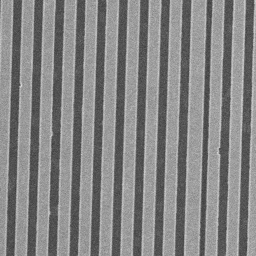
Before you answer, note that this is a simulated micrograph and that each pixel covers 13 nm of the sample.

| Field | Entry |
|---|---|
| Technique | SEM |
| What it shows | parallel lines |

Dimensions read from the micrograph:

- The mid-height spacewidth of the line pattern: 120 nanometers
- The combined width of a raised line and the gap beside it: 21.1 pixels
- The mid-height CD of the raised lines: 153 nanometers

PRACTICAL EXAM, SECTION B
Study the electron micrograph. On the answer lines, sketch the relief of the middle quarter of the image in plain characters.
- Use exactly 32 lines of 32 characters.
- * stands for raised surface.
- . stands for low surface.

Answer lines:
**...***..***...**...***..***...
**...***..***...**...***..***...
**...***..***...**...***..***..*
**...***..***..***...***..***..*
**...***..***..***...***..***..*
**...***..***..***...***..***..*
**...***..***...**...***..***..*
**...***..***...**...***..***..*
**...**...***...**...***..***..*
**...**...***..***...**...***..*
**...**...***..***...**...***..*
**...**...***..***...**...***..*
**...**...***..***...**...***..*
**...**...***..***...**...***..*
**...**...***..***...**...***..*
**...**...***..***...**...***..*
**...**...***..***...**...***..*
**...**...**...***...**...***..*
**..***...**...***..***...**...*
**..***...**...***..***...**...*
**..***...**...***..***...**...*
**..***...**...***..***...**...*
**..***...**...***..***...**...*
**..***...**...***..***...**...*
**..***...**...***..***...**...*
**..***...**...***..***...**...*
**..***...**...***..***...**...*
**..***..***...***..***..***...*
**..***..***...**...***..***...*
**..***..***...**...***..***...*
**..***..***...***..***..***...*
**..***..***...***..***..***...*